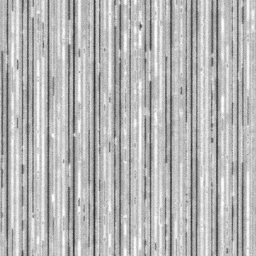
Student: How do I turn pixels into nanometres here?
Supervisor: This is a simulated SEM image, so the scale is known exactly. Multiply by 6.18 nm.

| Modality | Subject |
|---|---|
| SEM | parallel lines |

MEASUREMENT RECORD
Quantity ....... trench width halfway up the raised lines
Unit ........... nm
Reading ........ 6.2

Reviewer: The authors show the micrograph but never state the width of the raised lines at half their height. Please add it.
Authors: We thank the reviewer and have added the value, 24 nanometres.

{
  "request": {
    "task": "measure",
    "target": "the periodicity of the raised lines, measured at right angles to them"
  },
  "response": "31.6 nm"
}